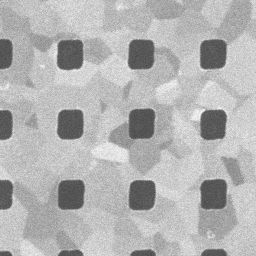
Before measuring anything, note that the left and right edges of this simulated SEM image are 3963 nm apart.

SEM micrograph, a regular array of holes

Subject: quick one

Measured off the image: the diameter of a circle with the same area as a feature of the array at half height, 0.487 µm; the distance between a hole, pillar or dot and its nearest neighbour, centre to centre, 1080 nm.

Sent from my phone